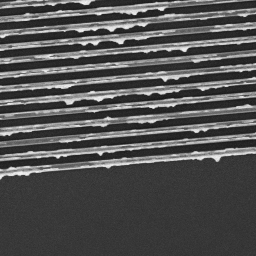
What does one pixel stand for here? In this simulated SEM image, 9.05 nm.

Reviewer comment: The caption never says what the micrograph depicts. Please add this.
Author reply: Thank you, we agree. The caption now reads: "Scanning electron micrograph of parallel lines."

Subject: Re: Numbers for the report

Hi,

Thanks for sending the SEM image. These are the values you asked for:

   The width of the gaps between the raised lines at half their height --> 69.9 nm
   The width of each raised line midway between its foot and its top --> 51.8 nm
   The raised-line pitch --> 125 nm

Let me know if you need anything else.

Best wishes